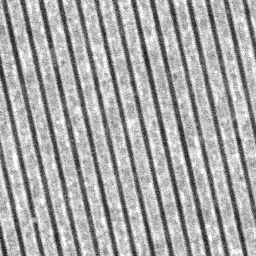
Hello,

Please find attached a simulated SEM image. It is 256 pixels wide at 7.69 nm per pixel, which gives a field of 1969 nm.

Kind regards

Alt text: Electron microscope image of parallel lines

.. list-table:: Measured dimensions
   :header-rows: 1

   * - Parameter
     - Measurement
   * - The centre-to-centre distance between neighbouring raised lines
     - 18.1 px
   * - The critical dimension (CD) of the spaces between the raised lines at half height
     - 6.84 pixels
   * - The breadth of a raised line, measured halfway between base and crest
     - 85.3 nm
